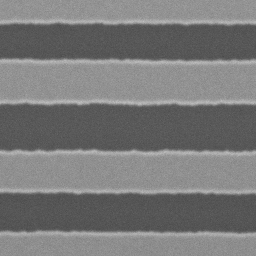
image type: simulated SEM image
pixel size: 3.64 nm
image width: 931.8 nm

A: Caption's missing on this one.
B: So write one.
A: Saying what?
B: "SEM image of lines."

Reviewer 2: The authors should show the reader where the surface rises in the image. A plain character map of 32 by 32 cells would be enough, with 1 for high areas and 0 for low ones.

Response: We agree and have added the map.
11111111111111111111111111111111
11111111111111111111111111111111
11111111111111111111111111111111
00000000000000000000000000000000
00000000000000000000000000000000
00000000000000000000000000000000
00000000000000000000000000000000
11110001111001100000000000000000
11111111111111111111111111111111
11111111111111111111111111111111
11111111111111111111111111111111
11111111111111111111111111111111
11111111111111111111111111111111
00000000000000000000000000000000
00000000000000000000000000000000
00000000000000000000000000000000
00000000000000000000000000000000
00000000000000000000000000000000
00000000000000000000000000000000
11111111111111111111111111111111
11111111111111111111111111111111
11111111111111111111111111111111
11111111111111111111111111111111
11111111111111111111111111111111
00000000000000000000000000000000
00000000000000000000000000000000
00000000000000000000000000000000
00000000000000000000000000000000
00000000000000000000000000000000
11111111111111111111111111111111
11111111111111111111111111111111
11111111111111111111111111111111